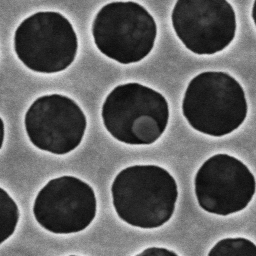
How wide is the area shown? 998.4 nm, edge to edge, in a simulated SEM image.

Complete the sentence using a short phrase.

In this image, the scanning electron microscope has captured a regular array of holes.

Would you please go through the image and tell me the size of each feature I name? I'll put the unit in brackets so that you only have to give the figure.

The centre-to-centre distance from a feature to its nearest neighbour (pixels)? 79.9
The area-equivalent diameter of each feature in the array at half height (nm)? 244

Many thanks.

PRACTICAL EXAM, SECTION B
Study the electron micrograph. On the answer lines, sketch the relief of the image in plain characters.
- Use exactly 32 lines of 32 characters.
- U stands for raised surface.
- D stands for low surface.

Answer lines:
UUUUUUUUUUUUUUDDDUUUUUDDDDDDDUUU
UUUUUDDUUUUUDDDDDDUUUUDDDDDDDUUU
UUUDDDDDUUUUDDDDDDDUUDDDDDDDDUUU
UUDDDDDDDUUUDDDDDDDDUUDDDDDDDUUU
UUDDDDDDDUUUDDDDDDDUUUDDDDDDDUUU
UUDDDDDDDDUUDDDDDDDUUUUDDDDDDUUU
UUDDDDDDDDUUUDDDDDDUUUUUDDDUUUUU
UUUDDDDDDUUUUUDDDUUUUUUUUUUUUUUU
UUUUDDDDUUUUUUUUUUUUUUUUUUUUUUUU
UUUUUUUUUUUUUUUUUUUUUUUUUDDDDUUU
UUUUUUUUUUUUUUUUDUUUUUUUDDDDDDUU
UUUUUUUUUUUUUUDDDDDDUUUDDDDDDDUU
UUUUDDDDDUUUUDDDDDDDDUUDDDDDDDDU
UUUUDDDDDDUUUDDDDDDDDUUDDDDDDDDU
UUUDDDDDDDDUUDDDDDDDDUUDDDDDDDDU
UUUDDDDDDDDUUDDDDDDDDUUUDDDDDDUU
UUUDDDDDDDDUUUDDDDDDUUUUUDDDDUUU
UUUUDDDDDDUUUUUDDDDUUUUUUUUUUUUU
UUUUUDDDDUUUUUUUUUUUUUUUUUUUUUUU
UUUUUUUUUUUUUUUUUUUUUUUUUUUDDUUU
UUUUUUUUUUUUUUUUUUUUUUUUUDDDDDUU
UUUUUUUUUUUUUUUDDDDDDUUUUDDDDDDU
UUUUUUDDDDUUUUDDDDDDDDUUDDDDDDDD
UUUUUDDDDDDUUUDDDDDDDDUUDDDDDDDD
DUUUUDDDDDDDUUDDDDDDDDUUUDDDDDDD
DDUUDDDDDDDDUUDDDDDDDDUUUDDDDDDU
DDUUDDDDDDDDUUUDDDDDDDUUUUDDDDUU
DDUUUDDDDDDDUUUDDDDDDUUUUUUUUUUU
DDUUUUDDDDDUUUUUUUDUUUUUUUUUUUUU
DUUUUUUUUUUUUUUUUUUUUUUUUUUUUUUU
UUUUUUUUUUUUUUUUUUUUUUUUUUUDDDDD
UUUUUUUUUUUUUUUUUUDDDDUUUUDDDDDD